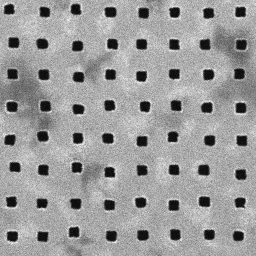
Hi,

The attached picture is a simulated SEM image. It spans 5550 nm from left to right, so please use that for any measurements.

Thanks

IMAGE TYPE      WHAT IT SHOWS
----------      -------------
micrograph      a regular array of holes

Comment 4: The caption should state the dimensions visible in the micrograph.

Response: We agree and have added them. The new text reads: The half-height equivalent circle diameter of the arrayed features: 259 nanometres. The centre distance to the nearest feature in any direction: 0.658 micrometres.